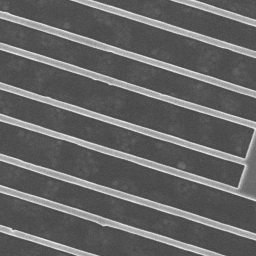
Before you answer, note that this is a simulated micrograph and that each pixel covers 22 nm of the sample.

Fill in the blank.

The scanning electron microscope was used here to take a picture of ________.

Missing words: parallel lines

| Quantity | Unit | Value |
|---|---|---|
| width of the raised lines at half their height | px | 6.08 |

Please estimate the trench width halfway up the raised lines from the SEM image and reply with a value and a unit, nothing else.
0.551 um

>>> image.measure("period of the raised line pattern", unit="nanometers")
747